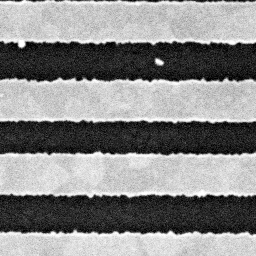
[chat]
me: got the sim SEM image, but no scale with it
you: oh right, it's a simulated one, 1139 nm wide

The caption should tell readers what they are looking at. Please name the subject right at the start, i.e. lines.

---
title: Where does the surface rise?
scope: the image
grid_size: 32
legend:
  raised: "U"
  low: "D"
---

UUUUUUUUUUUUUUUUUUUUUUUUUUUUUUUU
UUUUUUUUUUUUUUUUUUUUUUUUUUUUUUUU
UUUUUUUUUUUUUUUUUUUUUUUUUUUUUUUU
UUUUUUUUUUUUUUUUUUUUUUUUUUUUUUUU
UUUUUUUUUUUUUUUUUUUUUUUUUUUUUUUU
DDUDDDDDDDDDDDDDDDDDDDDDDDDDDDDD
DDDDDDDDDDDDDDDDDDDDDDDDDDDDDDDD
DDDDDDDDDDDDDDDDDDDDDDDDDDDDDDDD
DDDDDDDDDDDDDDDDDDDDDDDDDDDDDDDD
DDDDDDDDDDDDDDDDDDDDDDDDDDDDDDDD
UUUUUUUUUUUUUUUUUUUUUUUUUUUUUUUU
UUUUUUUUUUUUUUUUUUUUUUUUUUUUUUUU
UUUUUUUUUUUUUUUUUUUUUUUUUUUUUUUU
UUUUUUUUUUUUUUUUUUUUUUUUUUUUUUUU
UUUUUUUUUUUUUUUUUUUUUUUUUUUUUUUU
DDDDDDDDDDDDDDDDDDDDDDDDDDDDDDDD
DDDDDDDDDDDDDDDDDDDDDDDDDDDDDDDD
DDDDDDDDDDDDDDDDDDDDDDDDDDDDDDDD
DDDDDDDDDDDDDDDDDDDDDDDDDDDDDDDD
UUUUUUUUUUUUUUUUUUUUUUUUUUUUUUUU
UUUUUUUUUUUUUUUUUUUUUUUUUUUUUUUU
UUUUUUUUUUUUUUUUUUUUUUUUUUUUUUUU
UUUUUUUUUUUUUUUUUUUUUUUUUUUUUUUU
UUUUUUUUUUUUUUUUUUUUUUUUUUUUUUUU
DDDDDDDDDDDDDDDDUDDDDDDDDDDDDDDD
DDDDDDDDDDDDDDDDDDDDDDDDDDDDDDDD
DDDDDDDDDDDDDDDDDDDDDDDDDDDDDDDD
DDDDDDDDDDDDDDDDDDDDDDDDDDDDDDDD
DDDDDDDDDDDDDDDDDDDDDDDDDDDDDDDD
UUUUUUUUUUUUUUUUUUUUUUUUUUUUUUUU
UUUUUUUUUUUUUUUUUUUUUUUUUUUUUUUU
UUUUUUUUUUUUUUUUUUUUUUUUUUUUUUUU